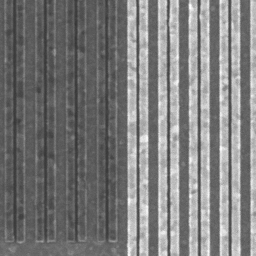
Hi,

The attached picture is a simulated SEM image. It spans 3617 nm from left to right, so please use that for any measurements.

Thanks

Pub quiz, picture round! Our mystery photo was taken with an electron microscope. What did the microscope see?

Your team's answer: parallel lines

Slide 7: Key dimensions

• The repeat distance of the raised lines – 213 nm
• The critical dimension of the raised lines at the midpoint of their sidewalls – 7.63 pixels